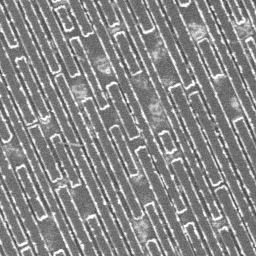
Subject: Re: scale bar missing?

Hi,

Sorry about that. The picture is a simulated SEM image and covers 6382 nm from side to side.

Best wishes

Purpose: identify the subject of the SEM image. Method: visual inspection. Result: parallel lines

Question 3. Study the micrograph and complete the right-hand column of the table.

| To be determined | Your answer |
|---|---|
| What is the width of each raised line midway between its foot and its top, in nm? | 256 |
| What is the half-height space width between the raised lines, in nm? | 108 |